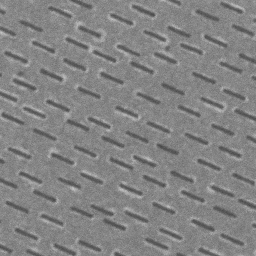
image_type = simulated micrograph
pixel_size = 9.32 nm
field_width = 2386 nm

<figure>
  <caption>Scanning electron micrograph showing a regular array of holes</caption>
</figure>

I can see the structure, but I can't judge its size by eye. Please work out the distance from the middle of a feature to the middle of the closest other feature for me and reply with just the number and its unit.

0.217 microns